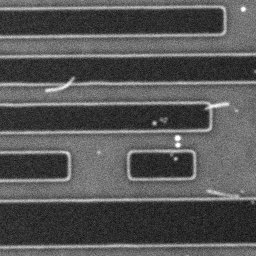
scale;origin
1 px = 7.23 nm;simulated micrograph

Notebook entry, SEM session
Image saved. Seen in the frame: groups of lines, slits or small figures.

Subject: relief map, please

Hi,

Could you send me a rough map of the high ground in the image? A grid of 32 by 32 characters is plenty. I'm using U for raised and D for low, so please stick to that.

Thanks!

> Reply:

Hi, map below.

DDDDDDDDDDDDDDDDDDDDDDDDDDDDDDDD
UUUUUUUUUUUUUUUUUUUUUUUUUUUUDDDD
UUUUUUUUUUUUUUUUUUUUUUUUUUUUDDDD
UUUUUUUUUUUUUUUUUUUUUUUUUUUUDDDD
UUUUUUUUUUUUDDDDDDDDDDDDDDDDDDDD
DDDDDDDDDDDDDDDDDDDDDDDDDDDDDDDD
DDDDDDDDDDDDDDDDDDDDDDDDDDDDDDDD
UUUUUUUUUUUUUUUUUUUUUUUUUUUUUUUU
UUUUUUUUUUUUUUUUUUUUUUUUUUUUUUUU
UUUUUUUUUUUUUUUUUUUUUUUUUUUUUUUU
UUUUUUUUUUUDDUUUDDDDDDDDDDDDDDDD
DDDDDDDDDDDDDDDDDDDDDDDDDDDDDDDD
DDDDDDDDDDDDDDDDDDDDDDDDDDDDDDDD
UUUUUUUUUUUUUUUUUUUUUUUUUUUDDDDD
UUUUUUUUUUUUUUUUUUUUUUUUUUDDDDDD
UUUUUUUUUUUUUUUUUUUUUUUUUUDDDDDD
UUUUUUUUUUDDDDDDDDDDDDDDDDDDDDDD
DDDDDDDDDDDDDDDDDDDDDDDDDDDDDDDD
DDDDDDDDDDDDDDDDDDDDDDDDDDDDDDDD
UUUUUUUUUDDDDDDDUUUUUUUUDDDDDDDD
UUUUUUUUUDDDDDDDUUUUUUUUDDDDDDDD
UUUUUUUUUDDDDDDDUUUUUUUUDDDDDDDD
UUUUUUUUDDDDDDDDDDDDDDDDDDDDDDDD
DDDDDDDDDDDDDDDDDDDDDDDDDDDDDDDD
DDDDDDDDDDDDDDDDDDDDDDDDDDDDDDDD
UUUUUUUUUUUUUUUUUUUUUUUUUUUUUUUU
UUUUUUUUUUUUUUUUUUUUUUUUUUUUUUUU
UUUUUUUUUUUUUUUUUUUUUUUUUUUUUUUU
UUUUUUUUUUUUUUUUUUUUUUUUUUUUUUUU
UUUUUUUUUUUUUUUUUUUUUUUUUUUUUUUU
UUUUUUUUUUUUUUUUUUUUUUUUUUUUUUUU
DDDDDDDDDDDDDDDDDDDDDDDDDDDDDDDD